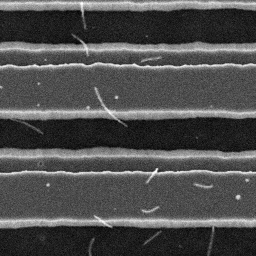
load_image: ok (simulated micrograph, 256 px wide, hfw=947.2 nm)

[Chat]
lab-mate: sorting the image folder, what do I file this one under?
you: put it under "lines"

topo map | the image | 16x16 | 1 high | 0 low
0000000000000000
0000000000000000
0000000000000000
1111111111111111
1111111111111111
1111111111111111
1111111111111111
0000000000000000
0000000000000000
0000000000000000
1111111111111111
1111111111111111
1111111111111111
1111111111111111
0000000000000000
0000000000000000